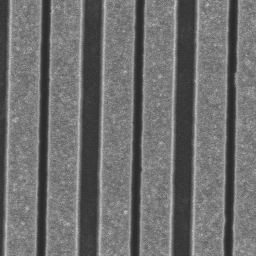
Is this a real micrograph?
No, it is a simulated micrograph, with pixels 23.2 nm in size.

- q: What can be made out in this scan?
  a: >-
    parallel lines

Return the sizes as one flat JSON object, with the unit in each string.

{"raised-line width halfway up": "766 nm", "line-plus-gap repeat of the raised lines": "1090 nanometers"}